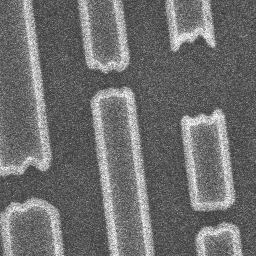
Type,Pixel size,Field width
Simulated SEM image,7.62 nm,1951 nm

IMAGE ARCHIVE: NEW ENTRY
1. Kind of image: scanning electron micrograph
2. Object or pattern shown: one or a few lines or trenches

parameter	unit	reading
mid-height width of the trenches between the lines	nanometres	412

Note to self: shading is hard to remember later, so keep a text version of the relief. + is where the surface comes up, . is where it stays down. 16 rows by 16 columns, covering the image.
++...++....++...
++...+++...++...
++...+++........
++....++........
++..............
++..............
+++...++........
+++...++.....+..
+++...++....++..
+++...+++...++..
+......++...++..
.......++...++..
.......++...++..
+++....++.......
++++...++....++.
++++...++....++.